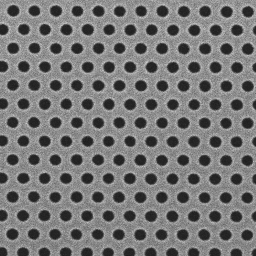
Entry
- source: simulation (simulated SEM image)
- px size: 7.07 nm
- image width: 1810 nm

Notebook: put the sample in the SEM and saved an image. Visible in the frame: a regular array of holes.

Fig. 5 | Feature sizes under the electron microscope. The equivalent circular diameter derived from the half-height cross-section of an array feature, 82.1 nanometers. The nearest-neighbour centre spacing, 149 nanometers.